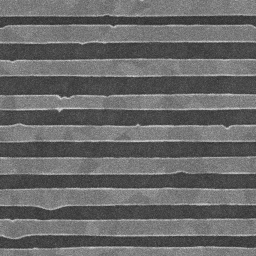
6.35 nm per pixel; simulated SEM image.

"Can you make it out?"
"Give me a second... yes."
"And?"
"parallel lines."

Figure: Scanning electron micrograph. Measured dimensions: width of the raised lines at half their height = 0.102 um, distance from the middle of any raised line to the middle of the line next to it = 205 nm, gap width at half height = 0.102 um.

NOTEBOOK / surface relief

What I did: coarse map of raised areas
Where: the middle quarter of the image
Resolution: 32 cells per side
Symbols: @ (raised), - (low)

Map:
@@@@@@@@@@@@@@@@@@@@@@@@@@@@@@@@
@@@@@@@@@@@@@@@@@@@@@@@@@@@@@@@@
@@@@@@@@@@@@@@@@@@@@@@@@@@@@@@@@
--------------------------------
--------------------------------
--------------------------------
--------------------------------
--------------------------------
@@@@@@@@@@@@@@@@@@@@@@@@@@@@@@@@
@@@@@@@@@@@@@@@@@@@@@@@@@@@@@@@@
@@@@@@@@@@@@@@@@@@@@@@@@@@@@@@@@
--------------------------------
--------------------------------
--------------------------------
--------------------------------
@-----------------@-------------
@@@@@@@@@@@@@@@@@@@@@@@@@@@@@@@@
@@@@@@@@@@@@@@@@@@@@@@@@@@@@@@@@
@@@@@@@@@@@@@@@@@@@@@@@@@@@@@@@@
--------------------------------
--------------------------------
--------------------------------
--------------------------------
@@@@----------------------------
@@@@@@@@@@@@@@@@@@@@@@@@@@@@@@@@
@@@@@@@@@@@@@@@@@@@@@@@@@@@@@@@@
@@@@@@@@@@@@@@@@@@@@@@@@@@@@@@@@
@@@@----------------------------
--------------------------------
--------------------------------
--------------------------------
@@@@@@@@@@@@@@@@@@@@@@@@@@@@@@@@